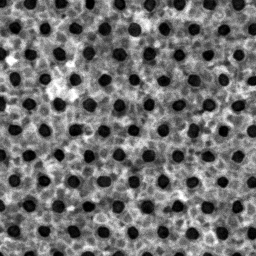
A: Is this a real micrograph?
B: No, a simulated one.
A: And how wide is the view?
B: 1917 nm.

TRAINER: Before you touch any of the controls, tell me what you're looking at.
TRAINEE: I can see a regular array of holes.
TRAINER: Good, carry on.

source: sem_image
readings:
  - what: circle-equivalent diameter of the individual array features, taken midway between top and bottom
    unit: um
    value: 0.0979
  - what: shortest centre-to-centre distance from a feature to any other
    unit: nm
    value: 217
